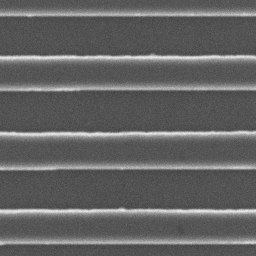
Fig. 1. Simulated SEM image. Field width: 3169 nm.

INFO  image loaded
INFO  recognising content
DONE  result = lines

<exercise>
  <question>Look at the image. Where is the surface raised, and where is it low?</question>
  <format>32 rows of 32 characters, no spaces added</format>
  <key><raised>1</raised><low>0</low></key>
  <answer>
11111111111111111111111111111111
11111111111111111111111111111111
00000000000000000000000000000000
00000000000000000000000000000000
00000000000000000000000000000000
00000000000000000000000000000000
00000000000000000000000000000000
11111111111111111111111111111111
11111111111111111111111111111111
11111111111111111111111111111111
11111111111111111111111111111111
00000000000000000000000000000000
00000000000000000000000000000000
00000000000000000000000000000000
00000000000000000000000000000000
00000000000000000000000000000000
00000000000000000000000000000000
11111111111111111111111111111111
11111111111111111111111111111111
11111111111111111111111111111111
11111111111111111111111111111111
00000000000000000000000000000000
00000000000000000000000000000000
00000000000000000000000000000000
00000000000000000000000000000000
00000000000000000000000000000000
11111111111111111111111111111111
11111111111111111111111111111111
11111111111111111111111111111111
11111111111111111111111111111111
00000000000000000000000000000000
00000000000000000000000000000000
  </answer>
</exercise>